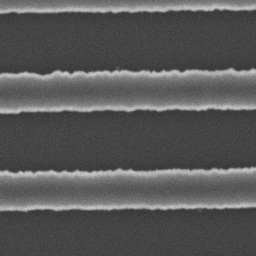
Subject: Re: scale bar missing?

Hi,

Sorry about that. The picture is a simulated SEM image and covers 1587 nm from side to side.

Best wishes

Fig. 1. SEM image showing lines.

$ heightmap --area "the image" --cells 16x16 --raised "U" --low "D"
UUUUUUUUUUUUUUUU
DDDDDDDDDDDDDDDD
DDDDDDDDDDDDDDDD
DDDDDDDDDDDDDDDD
DDDDDDUUUUUUUUUU
UUUUUUUUUUUUUUUU
UUUUUUUUUUUUUUUU
DDDDDDDDDDDDDDDD
DDDDDDDDDDDDDDDD
DDDDDDDDDDDDDDDD
DDDDDDDDDDDDDDDD
UUUUUUUUUUUUUUUU
UUUUUUUUUUUUUUUU
DDDDDDDDDDDDDDDD
DDDDDDDDDDDDDDDD
DDDDDDDDDDDDDDDD